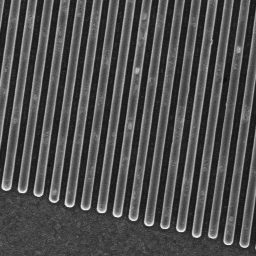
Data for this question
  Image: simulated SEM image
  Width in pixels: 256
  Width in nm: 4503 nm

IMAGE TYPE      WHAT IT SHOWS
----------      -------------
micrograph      parallel lines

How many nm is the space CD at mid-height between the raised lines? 133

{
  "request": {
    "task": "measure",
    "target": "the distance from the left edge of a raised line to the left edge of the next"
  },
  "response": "285 nm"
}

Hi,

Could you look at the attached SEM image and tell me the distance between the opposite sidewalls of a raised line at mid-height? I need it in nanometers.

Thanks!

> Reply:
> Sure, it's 150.